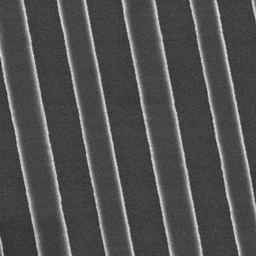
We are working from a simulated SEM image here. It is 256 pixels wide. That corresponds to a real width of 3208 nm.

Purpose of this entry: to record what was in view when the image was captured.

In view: lines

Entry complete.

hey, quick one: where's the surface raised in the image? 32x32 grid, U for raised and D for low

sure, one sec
UUUDDDDUUUUDDDDUUUUDDDDDUUUDDDDD
UUUDDDDUUUUDDDDUUUUUDDDDUUUDDDDD
UUUDDDDDUUUDDDDDUUUUDDDDUUUUDDDD
UUUUDDDDUUUDDDDDUUUUDDDDUUUUDDDD
UUUUDDDDUUUDDDDDUUUUDDDDDUUUDDDD
UUUUDDDDUUUUDDDDUUUUDDDDDUUUDDDD
UUUUDDDDUUUUDDDDUUUUUDDDDUUUDDDD
UUUUDDDDDUUUDDDDDUUUUDDDDUUUDDDD
UUUUDDDDDUUUDDDDDUUUUDDDDUUUUDDD
UUUUUDDDDUUUUDDDDUUUUDDDDDUUUDDD
DUUUUDDDDUUUUDDDDUUUUDDDDDUUUDDD
DUUUUDDDDUUUUDDDDUUUUDDDDDUUUDDD
DUUUUDDDDDUUUDDDDDUUUUDDDDUUUDDD
DUUUUDDDDDUUUDDDDDUUUUDDDDUUUUDD
DUUUUUDDDDUUUDDDDDUUUUDDDDDUUUDD
DDUUUUDDDDUUUUDDDDUUUUDDDDDUUUDD
DDUUUUDDDDUUUUDDDDUUUUDDDDDUUUDD
DDUUUUDDDDUUUUDDDDDUUUUDDDDUUUDD
DDUUUUDDDDDUUUDDDDDUUUUDDDDUUUUD
DDUUUUUDDDDUUUDDDDDUUUUDDDDDUUUD
DDDUUUUDDDDUUUUDDDDUUUUDDDDDUUUD
DDDUUUUDDDDUUUUDDDDUUUUDDDDDUUUD
DDDUUUUDDDDUUUUDDDDDUUUUDDDDUUUD
DDDUUUUDDDDDUUUDDDDDUUUUDDDDUUUU
DDDUUUUUDDDDUUUDDDDDUUUUDDDDUUUU
DDDDUUUUDDDDUUUDDDDDUUUUDDDDDUUU
DDDDUUUUDDDDUUUUDDDDUUUUDDDDDUUU
DDDDUUUUDDDDUUUUDDDDUUUUUDDDDUUU
DDDDUUUUDDDDDUUUDDDDDUUUUDDDDUUU
DDDDUUUUDDDDDUUUDDDDDUUUUDDDDUUU
DDDDDUUUUDDDDUUUDDDDDUUUUDDDDDUU
DDDDDUUUUDDDDUUUUDDDDUUUUDDDDDUU